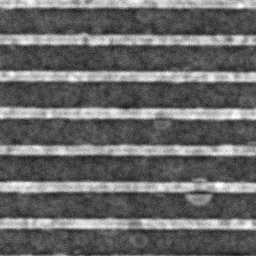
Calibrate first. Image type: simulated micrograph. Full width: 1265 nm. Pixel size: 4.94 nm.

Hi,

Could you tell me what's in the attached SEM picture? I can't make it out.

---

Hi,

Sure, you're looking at parallel lines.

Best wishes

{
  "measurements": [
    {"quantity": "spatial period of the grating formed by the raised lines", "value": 0.182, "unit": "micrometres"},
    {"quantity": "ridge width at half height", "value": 37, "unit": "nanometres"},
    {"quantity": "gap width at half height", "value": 145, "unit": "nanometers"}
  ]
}